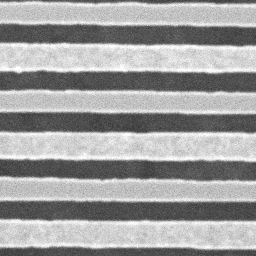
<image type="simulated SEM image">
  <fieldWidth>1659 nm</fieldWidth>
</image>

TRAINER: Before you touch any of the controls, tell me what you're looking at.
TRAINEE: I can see lines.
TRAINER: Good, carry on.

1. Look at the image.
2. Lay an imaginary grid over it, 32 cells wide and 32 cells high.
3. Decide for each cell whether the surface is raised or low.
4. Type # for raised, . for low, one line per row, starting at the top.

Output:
######.##.......................
################################
################################
................................
................................
###.............................
################################
################################
################################
................................
................................
.###############................
################################
################################
................................
................................
................................
################################
################################
################################
................................
................................
#########.......................
################################
################################
................................
................................
................................
################################
################################
################################
................................